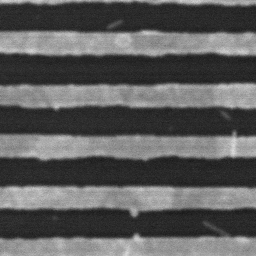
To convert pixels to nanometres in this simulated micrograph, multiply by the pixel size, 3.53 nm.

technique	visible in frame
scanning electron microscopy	lines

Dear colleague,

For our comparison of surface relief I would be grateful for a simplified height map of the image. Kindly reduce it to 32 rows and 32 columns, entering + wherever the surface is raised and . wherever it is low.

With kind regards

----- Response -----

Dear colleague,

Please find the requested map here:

............................++++
................................
................................
................................
++++++++++++++++++++++++++++++++
++++++++++++++++++++++++++++++++
.+++++++++++++++++++++++++.+++++
................................
................................
................................
................................
++++++++++++++++++++++++++++++++
++++++++++++++++++++++++++++++++
...............................+
................................
................................
................................
++++++++++++++++++++++++++++++++
++++++++++++++++++++++++++++++++
+++++++++++...++++++..++++++++++
................................
................................
................................
++++++++++++++++++++++..........
++++++++++++++++++++++++++++++++
++++++++++++++++++++++++++++++++
................................
................................
................................
................................
++++++++++++++++++++++++++++++++
++++++++++++++++++++++++++++++++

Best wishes